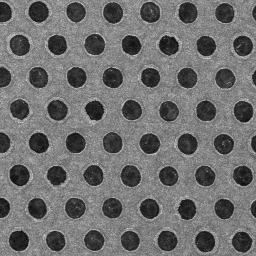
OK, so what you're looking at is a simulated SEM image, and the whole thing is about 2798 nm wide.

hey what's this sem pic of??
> a regular array of holes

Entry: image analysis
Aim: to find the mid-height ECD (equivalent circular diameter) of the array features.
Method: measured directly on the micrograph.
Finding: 224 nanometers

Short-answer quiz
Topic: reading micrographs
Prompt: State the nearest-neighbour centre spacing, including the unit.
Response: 0.401 µm